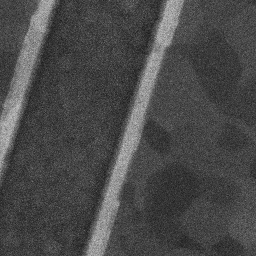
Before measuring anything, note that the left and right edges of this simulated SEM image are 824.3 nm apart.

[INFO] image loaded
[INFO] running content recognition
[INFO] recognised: one or a few lines or trenches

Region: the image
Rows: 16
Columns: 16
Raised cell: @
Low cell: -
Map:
@@@--------@@@@@
@@@-------@@@@@@
@@--------@@@@@@
@@--------@@@@@@
@@-------@@@@@@@
@--------@@@@@@@
@--------@@@@@@@
@--------@@@@@@@
--------@@@@@@@@
--------@@@@@@@@
--------@@@@@@@@
-------@@@@@@@@@
-------@@@@@@@@@
-------@@@@@@@@@
------@@@@@@@@@@
------@@@@@@@@@@